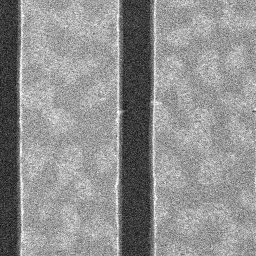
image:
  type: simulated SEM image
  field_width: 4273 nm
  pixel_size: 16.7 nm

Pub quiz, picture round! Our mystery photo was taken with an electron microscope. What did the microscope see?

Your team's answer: one or a few lines or trenches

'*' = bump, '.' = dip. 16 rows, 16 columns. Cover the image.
.*******..******
.******...******
.******...******
.******...******
.******...******
.******...******
.*******..******
.*******..******
.******...******
.******...******
.******..*******
.******...******
.******...******
.******...******
.******...******
.******...******